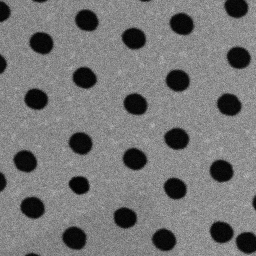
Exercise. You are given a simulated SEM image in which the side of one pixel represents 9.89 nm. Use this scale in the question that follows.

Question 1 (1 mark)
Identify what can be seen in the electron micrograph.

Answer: a regular array of holes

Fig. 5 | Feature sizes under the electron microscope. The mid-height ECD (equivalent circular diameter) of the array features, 221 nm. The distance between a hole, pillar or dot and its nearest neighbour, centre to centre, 479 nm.